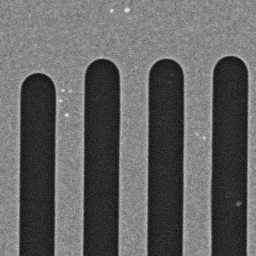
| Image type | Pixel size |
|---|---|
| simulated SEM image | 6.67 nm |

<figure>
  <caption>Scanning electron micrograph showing groups of lines, slits or small figures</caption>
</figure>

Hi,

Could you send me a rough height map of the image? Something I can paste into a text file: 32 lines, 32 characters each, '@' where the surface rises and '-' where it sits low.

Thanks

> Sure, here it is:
@@@@@@@@@@@@@@@@@@@@@@@@@@@@@@@@
@@@@@@@@@@@@@@@@@@@@@@@@@@@@@@@@
@@@@@@@@@@@@@@@@@@@@@@@@@@@@@@@@
@@@@@@@@@@@@@@@@@@@@@@@@@@@@@@@@
@@@@@@@@@@@@@@@@@@@@@@@@@@@@@@@@
@@@@@@@@@@@@@@@@@@@@@@@@@@@@@@@@
@@@@@@@@@@@@@@@@@@@@@@@@@@@@@@@@
@@@@@@@@@@@@--@@@@@@--@@@@@---@@
@@@@@@@@@@@----@@@@----@@@@----@
@@@@--@@@@@----@@@@----@@@@----@
@@@----@@@-----@@@-----@@@-----@
@@@----@@@-----@@@-----@@@-----@
@@-----@@@-----@@@-----@@@-----@
@@-----@@@-----@@@-----@@@-----@
@@-----@@@-----@@@-----@@@-----@
@@-----@@@-----@@@-----@@@-----@
@@-----@@@-----@@@-----@@@-----@
@@-----@@@-----@@@-----@@@-----@
@@-----@@@-----@@@-----@@@-----@
@@-----@@@-----@@@-----@@@-----@
@@-----@@@-----@@@-----@@@-----@
@@-----@@@-----@@@-----@@@-----@
@@-----@@@-----@@@-----@@@-----@
@@-----@@@-----@@@-----@@@-----@
@@-----@@@-----@@@-----@@@-----@
@@-----@@@-----@@@-----@@@-----@
@@-----@@@-----@@@-----@@@-----@
@@-----@@@-----@@@-----@@@-----@
@@-----@@@-----@@@-----@@@-----@
@@-----@@@-----@@@-----@@@-----@
@@-----@@@-----@@@-----@@@-----@
@@-----@@@-----@@@-----@@@-----@